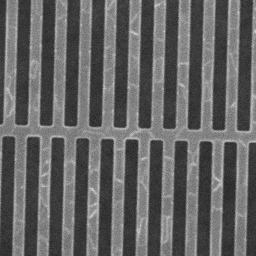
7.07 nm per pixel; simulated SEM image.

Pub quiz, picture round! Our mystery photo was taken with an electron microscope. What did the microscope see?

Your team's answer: groups of lines, slits or small figures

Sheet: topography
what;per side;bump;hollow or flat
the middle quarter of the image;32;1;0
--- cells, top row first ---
00001100001110001110001110000110
00001100001110001110001110000110
00001100001100001110001110000110
00001100001100001110001110001110
00001100001100001110001110001110
00001100001100001110001110001110
00001100001100001110001110001110
00001100001100001110001110001110
00001100001100001110001110001110
00001100001100001100001110001110
00001100001100001100001110001110
00001100001100001100001110001110
00001100001100001100001110001110
00001100001100001100001110001110
00011100001100001100001110001110
00011100001100001100001110001110
11111111111111111111111111011110
11111111111111111111111111111111
11100011110011110011111111111111
11100001100001100001100001110001
11100001100001100001100001100001
11100001100001100001100001100001
11100011100001100001100001100001
11100011100001100001100001100001
11100011100001100001100001100001
11100011100001100001100001100001
11100011100001100001100001100001
11100011100001100001100001100001
11100011100001100001100001100001
11000011100001100001100001100001
11000011100011100001100001100001
11000011100011100001100001100001